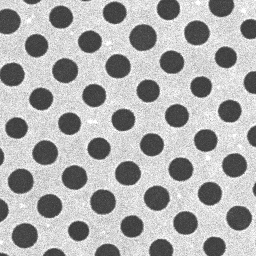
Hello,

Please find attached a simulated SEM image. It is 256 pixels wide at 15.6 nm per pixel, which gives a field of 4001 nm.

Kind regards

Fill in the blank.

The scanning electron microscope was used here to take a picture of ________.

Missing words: a regular array of holes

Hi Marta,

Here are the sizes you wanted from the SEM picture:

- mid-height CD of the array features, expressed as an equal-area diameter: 371 nm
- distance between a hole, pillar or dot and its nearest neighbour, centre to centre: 587 nanometers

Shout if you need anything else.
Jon